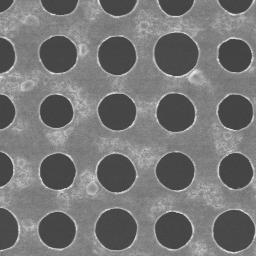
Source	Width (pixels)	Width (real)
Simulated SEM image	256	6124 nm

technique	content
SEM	a regular array of holes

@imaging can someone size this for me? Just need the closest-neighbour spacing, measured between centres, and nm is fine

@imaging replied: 1380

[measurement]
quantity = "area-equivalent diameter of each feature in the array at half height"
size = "890 nanometers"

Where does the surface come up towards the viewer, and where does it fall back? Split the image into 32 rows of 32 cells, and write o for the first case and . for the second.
..ooo.....ooo....ooo....oooo...o
oooooo...oooo...ooooo..oooooo..o
oooooooooooooooooooooooooooooooo
oooooooooooooooooooooooooooooooo
ooooooo.ooooooooooooo..ooooooooo
.oooo....oooo....ooo....oooo...o
..ooo.....oo.....oo......oo....o
..ooo.....oo.....oo......oo....o
.ooooo...oooo...oooo....oooo...o
oooooooooooooooooooooooooooooooo
oooooooooooooooooooooooooooooooo
oooooooooooooooooooooooooooooooo
.oooo...ooooo...oooo....oooo...o
..ooo....ooo.....ooo....ooo.....
..ooo....ooo.....ooo....ooo.....
.ooooo..ooooo...oooo....oooo...o
ooooooooooooooooooooo.oooooooooo
oooooooooooooooooooooooooooooooo
oooooooooooooooooooooooooooooooo
.ooooo..ooooo..oooooo..ooooo...o
..ooo....ooo.....ooo....oooo...o
..ooo....ooo.....ooo....ooo.....
.oooo....ooo.....ooo....oooo...o
oooooo..ooooo...ooooo..oooooo.oo
oooooooooooooooooooooooooooooooo
oooooooooooooooooooooooooooooooo
.oooooooooooo...oooooooooooo..oo
..ooo....ooo.....ooo....ooo....o
..ooo....ooo.....oo.....ooo.....
..ooo....ooo.....ooo....ooo.....
..oooo...oooo...oooo...oooo....o
oooooooooooooooooooooooooooooooo